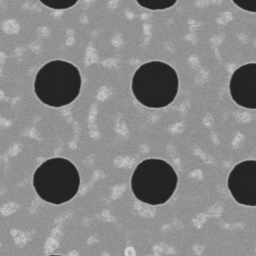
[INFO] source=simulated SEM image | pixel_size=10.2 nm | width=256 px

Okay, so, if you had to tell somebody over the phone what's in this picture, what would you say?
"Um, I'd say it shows holes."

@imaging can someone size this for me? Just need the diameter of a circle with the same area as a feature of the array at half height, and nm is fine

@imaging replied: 476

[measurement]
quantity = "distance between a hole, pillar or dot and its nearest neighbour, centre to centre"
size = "991 nm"